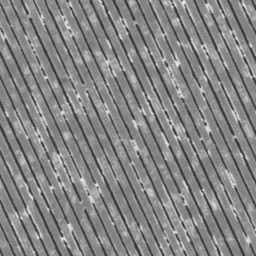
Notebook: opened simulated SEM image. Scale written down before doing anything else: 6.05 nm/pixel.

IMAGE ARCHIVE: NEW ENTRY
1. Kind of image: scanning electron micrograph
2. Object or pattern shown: parallel lines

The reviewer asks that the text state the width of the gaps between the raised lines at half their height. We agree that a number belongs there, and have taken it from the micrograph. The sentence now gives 0.0158 microns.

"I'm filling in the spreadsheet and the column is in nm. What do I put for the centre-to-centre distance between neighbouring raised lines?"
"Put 63.1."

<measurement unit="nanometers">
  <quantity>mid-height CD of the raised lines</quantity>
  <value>48.1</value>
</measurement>